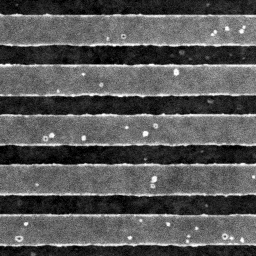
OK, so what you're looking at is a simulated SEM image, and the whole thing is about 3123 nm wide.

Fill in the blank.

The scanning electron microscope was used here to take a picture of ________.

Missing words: lines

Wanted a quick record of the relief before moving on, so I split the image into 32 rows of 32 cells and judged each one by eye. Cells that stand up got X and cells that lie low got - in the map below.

--------------------------------
--------------------------------
XXXXXXXXXXXXXXXXXXXXXXXXXXXXXXXX
XXXXXXXXXXXXXXXXXXXXXXXXXXXXXXXX
XXXXXXXXXXXXXXXXXXXXXXXXXXXXXXXX
XXXXXXXXXXXXXXXXXXXXXXXXXXXXXXXX
--------------------------------
--------------------------------
XXXXXXXXXXXXXXXXXXXXXXXXXXXXXXXX
XXXXXXXXXXXXXXXXXXXXXXXXXXXXXXXX
XXXXXXXXXXXXXXXXXXXXXXXXXXXXXXXX
XXXXXXXXXXXXXXXXXXXXXXXXXXXXXXXX
--------------------------------
--------------------------------
XXXXXXXXXXXXXXXXXXXXXXXXXXXXXXXX
XXXXXXXXXXXXXXXXXXXXXXXXXXXXXXXX
XXXXXXXXXXXXXXXXXXXXXXXXXXXXXXXX
XXXXXXXXXXXXXXXXXXXXXXXXXXXXXXXX
--------------------------------
--------------------------------
--------------------------------
XXXXXXXXXXXXXXXXXXXXXXXXXXXXXXXX
XXXXXXXXXXXXXXXXXXXXXXXXXXXXXXXX
XXXXXXXXXXXXXXXXXXXXXXXXXXXXXXXX
--------------------------------
--------------------------------
--------------------------------
XXXXXXXXXXXXXXXXXXXXXXXXXXXXXXXX
XXXXXXXXXXXXXXXXXXXXXXXXXXXXXXXX
XXXXXXXXXXXXXXXXXXXXXXXXXXXXXXXX
XXXXXXXXXXXXXXXXXXXXXXXXXXXXXXXX
--------------------------------